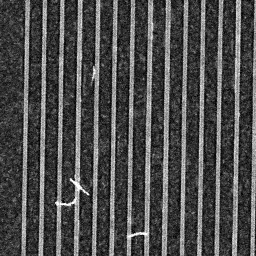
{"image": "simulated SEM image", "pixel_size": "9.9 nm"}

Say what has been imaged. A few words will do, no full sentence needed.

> parallel lines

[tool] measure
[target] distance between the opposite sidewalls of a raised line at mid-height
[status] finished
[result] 38.4 nanometres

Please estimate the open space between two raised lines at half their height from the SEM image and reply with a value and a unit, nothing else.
13.5 px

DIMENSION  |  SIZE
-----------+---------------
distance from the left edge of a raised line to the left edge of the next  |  174 nm